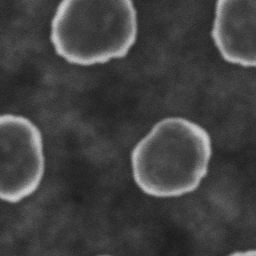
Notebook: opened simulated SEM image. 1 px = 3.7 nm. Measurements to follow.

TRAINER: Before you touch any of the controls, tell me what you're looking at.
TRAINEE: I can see raised bodies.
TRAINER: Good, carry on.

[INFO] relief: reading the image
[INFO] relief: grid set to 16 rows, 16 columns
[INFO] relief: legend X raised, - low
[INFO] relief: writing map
----XXXX------XX
---XXXXX------XX
---XXXXX------XX
----XXX-------XX
----------------
----------------
----------------
X---------X-----
XX-------XXXX---
XXX------XXXX---
XXX-----XXXXX---
XX-------XXX----
----------------
----------------
----------------
----------------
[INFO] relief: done